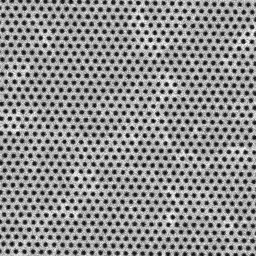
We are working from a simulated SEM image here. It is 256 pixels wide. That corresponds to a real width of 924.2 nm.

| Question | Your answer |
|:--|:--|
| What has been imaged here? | a regular array of holes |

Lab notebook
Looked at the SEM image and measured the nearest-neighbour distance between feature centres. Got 29 nm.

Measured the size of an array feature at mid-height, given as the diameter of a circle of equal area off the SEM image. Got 16.8 nanometres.